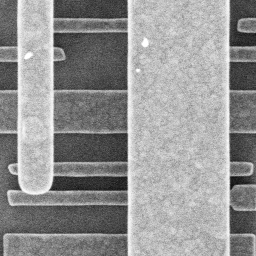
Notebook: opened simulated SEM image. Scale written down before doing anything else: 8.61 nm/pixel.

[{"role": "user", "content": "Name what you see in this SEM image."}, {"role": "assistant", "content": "wiring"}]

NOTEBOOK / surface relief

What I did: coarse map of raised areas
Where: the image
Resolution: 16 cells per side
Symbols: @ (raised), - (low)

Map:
-@@-----@@@@@@--
-@@-----@@@@@@--
-@@-----@@@@@@--
-@@-----@@@@@@--
-@@-----@@@@@@--
-@@-----@@@@@@--
-@@-----@@@@@@--
-@@-----@@@@@@--
-@@-----@@@@@@--
-@@-----@@@@@@--
-@@-----@@@@@@--
-@@-----@@@@@@--
--------@@@@@@--
--------@@@@@@--
--------@@@@@@--
--------@@@@@@--